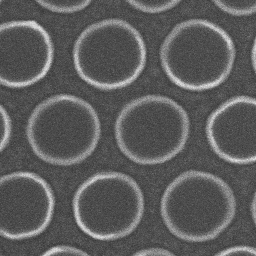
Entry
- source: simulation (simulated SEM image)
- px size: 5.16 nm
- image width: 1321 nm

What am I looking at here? raised bodies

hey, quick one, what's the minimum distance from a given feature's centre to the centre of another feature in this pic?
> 452 nanometres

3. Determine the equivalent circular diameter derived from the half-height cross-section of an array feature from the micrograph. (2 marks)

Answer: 354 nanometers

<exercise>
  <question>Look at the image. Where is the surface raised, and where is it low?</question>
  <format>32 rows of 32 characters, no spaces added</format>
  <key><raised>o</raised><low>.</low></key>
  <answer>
.....oooooo......ooooo.....ooooo
.............................oo.
................................
ooooo......ooooo......ooooo.....
oooooo....ooooooo....ooooooo....
oooooo....oooooooo...oooooooo...
oooooo...ooooooooo..ooooooooo...
oooooo...ooooooooo..ooooooooo...
oooooo....oooooooo...oooooooo...
ooooo.....ooooooo....ooooooo....
.ooo.......ooooo......ooooo.....
................................
......oooo........ooo........ooo
.....oooooo.....ooooooo.....oooo
o...oooooooo...oooooooo...oooooo
o...oooooooo...oooooooo...oooooo
o...oooooooo...oooooooo...oooooo
o...oooooooo...oooooooo...oooooo
....oooooooo...oooooooo....ooooo
.....oooooo.....ooooo.......oooo
................................
................................
ooooo......ooooo......ooooo.....
oooooo....ooooooo....ooooooo....
oooooo....oooooooo...oooooooo...
ooooooo..ooooooooo..ooooooooo...
oooooo...ooooooooo..ooooooooo...
oooooo....ooooooo....oooooooo...
oooooo....ooooooo....ooooooo....
.oo.........ooo.......ooooo.....
................................
......oooo........oo........oooo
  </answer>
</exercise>